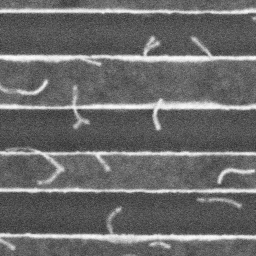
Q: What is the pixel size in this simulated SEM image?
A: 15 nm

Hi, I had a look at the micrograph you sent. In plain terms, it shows lines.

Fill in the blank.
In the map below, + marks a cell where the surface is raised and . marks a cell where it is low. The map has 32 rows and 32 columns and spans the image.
++++++++++++++++++++++++++++++++
.....................++++.++++..
................................
................................
................................
................................
................................
++++++++++++++++++++++++++++++++
++++++++++++++++++++++++++++++++
++++++++++++++++++++++++++++++++
++++++++++++++++++++++++++++++++
++++++++++++++++++++++++++++++++
++++++++++++++++++++++++++++++++
...+++++++++.......+.......+++++
................................
................................
................................
................................
................................
++++++++++++++++++++++++++++++++
++++++++++++++++++++++++++++++++
++++++++++++++++++++++++++++++++
++++++++++++++++++++++++++++++++
++++++++++++++++++++++++++++++++
................................
................................
................................
................................
................................
++++++..........................
++++++++++++++++++++++++++++++++
++++++++++++++++++++++++++++++++